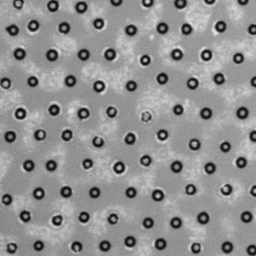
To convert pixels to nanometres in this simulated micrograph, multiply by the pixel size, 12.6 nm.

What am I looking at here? a regular array of ring-shaped grooves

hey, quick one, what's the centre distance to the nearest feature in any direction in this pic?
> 340 nanometers